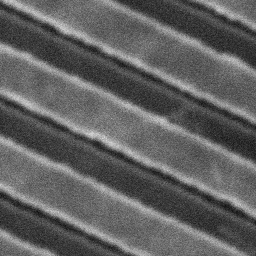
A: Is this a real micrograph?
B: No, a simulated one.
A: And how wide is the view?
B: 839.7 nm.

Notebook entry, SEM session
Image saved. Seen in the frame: lines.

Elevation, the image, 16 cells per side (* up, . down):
.*******.....***
...*******.....*
.....*******....
**.....*******..
****.....*******
******.....*****
.*******......**
....******......
......******....
**......******..
****......******
******......****
.*******......**
....******......
......******....
**......******..